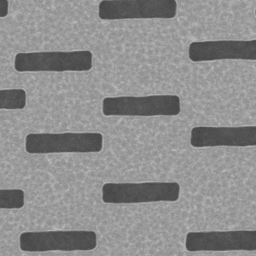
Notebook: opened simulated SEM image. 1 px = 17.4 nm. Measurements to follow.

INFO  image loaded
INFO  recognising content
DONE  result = holes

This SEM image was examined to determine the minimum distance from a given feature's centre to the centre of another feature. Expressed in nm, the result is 1500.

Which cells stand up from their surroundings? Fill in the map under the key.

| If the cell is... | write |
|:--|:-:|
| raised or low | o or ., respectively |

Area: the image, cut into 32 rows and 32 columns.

.ooooooooooo..........oooooooooo
.ooooooooooo..........oooooooooo
ooooooooooooo.oooooooooooooooooo
oooooooooooooooooooooooooooooooo
oooooooooooooooooooooooooooooooo
oooooooooooooooooooooooo........
oooo.......ooooooooooooo........
oo..........oooooooooooo...oooo.
oo.........ooooooooooooooooooooo
oooooooooooooooooooooooooooooooo
oooooooooooooooooooooooooooooooo
...ooooooooooooooooooooooooooooo
...oooooooooo.........oooooooooo
...oooooooooo..........ooooooooo
ooooooooooooooo..o.ooooooooooooo
oooooooooooooooooooooooooooooooo
ooooooooooo.oooooooooooo........
ooo..........ooooooooooo........
ooo..........ooooooooooooooooooo
oooooooooooooooooooooooooooooooo
oooooooooooooooooooooooooooooooo
oooooooooooooooooooooooooooooooo
oooooooooooooooooooooooooooooooo
ooooooooooooo.........oooooooooo
...oooooooooo.........oooooooooo
...ooooooooooooooooooooooooooooo
oooooooooooooooooooooooooooooooo
oooooooooooooooooooooooooooooooo
oooooooooooooooooooooooooooooooo
ooo.........ooooooooooo.........
oo..........ooooooooooo.........
ooo..ooooooooooooooooooooooooooo